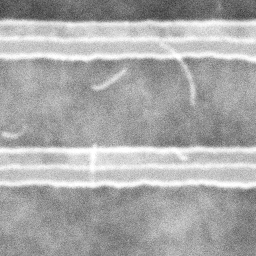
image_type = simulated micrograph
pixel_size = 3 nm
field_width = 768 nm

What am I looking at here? lines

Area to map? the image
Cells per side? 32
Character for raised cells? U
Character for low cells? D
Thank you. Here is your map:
DDDDDDDDDDDDDDDDDDDDDDDDDDDDDDDD
DDDDDDDDDDDDDDDDDDDDDDDDDDDDDDDD
DDDDDDDDDDDDDDDDDDDDDDDDDDDDDDDD
UUUUUUUUUUUUUUUUUUUUUUUUUUUUUUUU
UUUUUUUUUUUUUUUUUUUUUUUUUUUUUUUU
UUUUUUUUUUUUUUUUUUUUUUUUUUUUUUUU
UUUUUUUUUUUUUUUUUUUUUUUUUUUUUUUU
DDDDDDDDDDDDDDDDDDDDDDDDDDDDDDDD
DDDDDDDDDDDDDDDDDDDDDDDDDDDDDDDD
DDDDDDDDDDDDDDDDDDDDDDDDDDDDDDDD
DDDDDDDDDDDDDDDDDDDDDDDDDDDDDDDD
DDDDDDDDDDDDDDDDDDDDDDDDDDDDDDDD
DDDDDDDDDDDDDDDDDDDDDDDDDDDDDDDD
DDDDDDDDDDDDDDDDDDDDDDDDDDDDDDDD
DDDDDDDDDDDDDDDDDDDDDDDDDDDDDDDD
DDDDDDDDDDDDDDDDDDDDDDDDDDDDDDDD
DDDDDDDDDDDDDDDDDDDDDDDDDDDDDDDD
DDDDDDDDDDDDDDDDDDDDDDDDDDDDDDDD
DDDDDDDDDDDDDDDDDDDDDDDDDDDDDDDD
UUUUUUUUUUUUUUUUUUUUUUUUUUUUUUUU
UUUUUUUUUUUUUUUUUUUUUUUUUUUUUUUU
UUUUUUUUUUUUUUUUUUUUUUUUUUUUUUUU
UUUUUUUUUUUUUUUUUUUUUUUUUUUUUUUU
DDDDDDDDDDDDDDDDDDDDDDDDDDDDDDDD
DDDDDDDDDDDDDDDDDDDDDDDDDDDDDDDD
DDDDDDDDDDDDDDDDDDDDDDDDDDDDDDDD
DDDDDDDDDDDDDDDDDDDDDDDDDDDDDDDD
DDDDDDDDDDDDDDDDDDDDDDDDDDDDDDDD
DDDDDDDDDDDDDDDDDDDDDDDDDDDDDDDD
DDDDDDDDDDDDDDDDDDDDDDDDDDDDDDDD
DDDDDDDDDDDDDDDDDDDDDDDDDDDDDDDD
DDDDDDDDDDDDDDDDDDDDDDDDDDDDDDDD